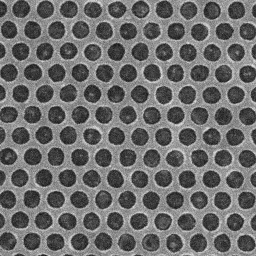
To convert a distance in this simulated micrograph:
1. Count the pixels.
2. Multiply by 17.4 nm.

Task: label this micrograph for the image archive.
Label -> a regular array of holes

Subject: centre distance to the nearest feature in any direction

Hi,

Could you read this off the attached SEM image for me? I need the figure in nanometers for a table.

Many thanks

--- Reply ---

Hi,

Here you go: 408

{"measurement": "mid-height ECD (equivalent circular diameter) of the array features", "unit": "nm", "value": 318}